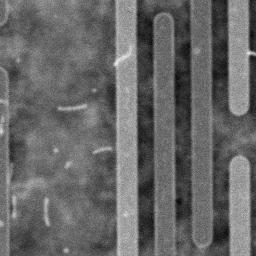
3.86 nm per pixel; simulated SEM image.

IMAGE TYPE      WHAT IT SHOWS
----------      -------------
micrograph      groups of lines, slits or small figures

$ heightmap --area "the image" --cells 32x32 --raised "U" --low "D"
UDDDDDDDDDDDDDDUUDDDDDDDUUDDDUUD
UDDDDDDDDDDDDDDUUDDDDDDDUUDDDUUD
UDDDDDDDDDDDDDDUUDDUUUDDUUDDDUUD
DDDDDDDDDDDDDDDUUDDUUUDDUUDDDUUD
DDDDDDDDDDDDDDDUUDDUUUDDUUDDDUUD
DDDDDDDDDDDDDDDUUDDUUUDDUUDDDUUD
DDDDDDDDDDDDDDDUUDDUUUDDUUDDDUUD
DDDDDDDDDDDDDDUUUDDUUUDDUUDDDUUD
DDDDDDDDDDDDDDUUUDDUUUDDUUDDDUUD
UDDDDDDDDDDDDDDUUDDUUUDDUUDDDUUD
UDDDDDDDDDDDDDDUUDDUUUDDUUDDDUUD
UDDDDDDDDDDDDDDUUDDUUUDDUUDDDUUD
UDDDDDDDDDDDDDDUUDDUUUDDUUDDDUUD
UDDDDDDDDDDDDDDUUDDUUUDDUUDDDUUD
UDDDDDDDDDDDDDDUUDDUUUDDUUDDDDDD
UDDDDDDDDDDDDDDUUDDUUUDDUUDDDDDD
UDDDDDDDDDDDDDDUUDDUUUDDUUDDDDDD
UDDDDDDDDDDDDDDUUDDUUUDDUUDDDDDD
UDDDDDDDDDDDDDDUUDDUUUDDUUDDDDDD
UDDDDDDDDDDDDDDUUDDUUUDDUUDDDDDD
UDDDDDDDDDDDDDDUUDDUUUDDUUDDDUUD
UDDDDDDDDDDDDDDUUDDUUUDDUUDDDUUD
UDDDDDDDDDDDDDDUUDDUUUDDUUDDDUUD
UDDDDDDDDDDDDDDUUDDUUUDDUUDDDUUD
UDDDDDDDDDDDDDDUUDDUUUDDUUDDDUUD
UDDDDDDDDDDDDDDUUDDUUUDDUUDDDUUD
UDDDDDDDDDDDDDDUUDDUUUDDUUDDDUUD
UDDDDDDDDDDDDDDUUDDUUUDDUUDDDUUD
UDDDDDDDDDDDDDDUUDDUUUDDUUDDDUUD
UDDDDDDDDDDDDDDUUDDUUUDDUUDDDUUD
UDDDDDDDDDDDDDDUUDDUUUDDDUDDDUUD
UDDDDDDDDDDDDDDUUDDUUUDDDDDDDUUD